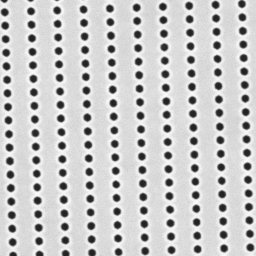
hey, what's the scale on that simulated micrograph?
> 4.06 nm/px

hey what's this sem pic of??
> a regular array of holes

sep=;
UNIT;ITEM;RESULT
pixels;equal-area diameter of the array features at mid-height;7.91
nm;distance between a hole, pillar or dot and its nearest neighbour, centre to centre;54.5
